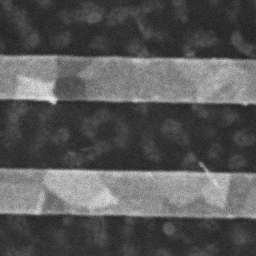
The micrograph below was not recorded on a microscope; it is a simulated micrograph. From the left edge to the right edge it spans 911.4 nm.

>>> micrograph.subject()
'one or a few lines or trenches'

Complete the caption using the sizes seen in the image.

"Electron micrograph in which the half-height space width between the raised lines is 71.2 pixels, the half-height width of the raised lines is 150 nm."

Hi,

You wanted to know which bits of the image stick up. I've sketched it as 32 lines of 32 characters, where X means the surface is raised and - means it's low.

--------------------------------
--------------------------------
-----------X--------------------
--------------------------------
--------------------------------
--------------------------------
--------------------------------
XXXXXXXXXXXXXXXXXXXXXX--X-X-----
XXXXXXXXXXXXXXXXXXXXXXXXXXXXXXXX
XXXXXXXXXXXXXXXXXXXXXXXXXXXXXXXX
XXXXXXXXXXXXXXXXXXXXXXXXXXXXXXXX
XXXXXXXXXXXXXXXXXXXXXXXXXXXXXXXX
------X------XXXXXXXXXXXXXXXXXXX
--------------------------------
--------------------------------
--------------------------------
--------------------------------
--------------------------------
--------------------------------
--------------------------------
--------------------------------
XXXXXXXXXXX---------------------
XXXXXXXXXXXXXXXXXXXXXXXXXXXXXXXX
XXXXXXXXXXXXXXXXXXXXXXXXXXXXXXXX
XXXXXXXXXXXXXXXXXXXXXXXXXXXXXXXX
XXXXXXXXXXXXXXXXXXXXXXXXXXXXXXXX
XXXXXXXXXXXXXXXXXXXXXXXXXXXXXXXX
--------------------------------
--------------------------------
--------------------------------
--------------------------------
--------------------------------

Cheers